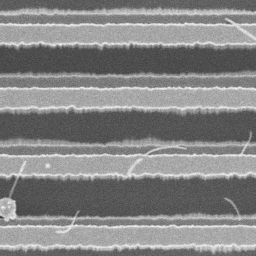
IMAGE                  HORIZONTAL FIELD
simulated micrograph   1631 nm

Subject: lines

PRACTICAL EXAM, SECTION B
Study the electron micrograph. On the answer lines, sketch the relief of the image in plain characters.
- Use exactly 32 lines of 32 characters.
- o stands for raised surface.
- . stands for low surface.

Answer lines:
................................
................................
oooooooooooooooooooooooooooooooo
oooooooooooooooooooooooooooooooo
oooooooooooooooooooooooooooooooo
oooooooooooooooooooooooooooooooo
................................
................................
................................
oooo.o.ooooo.oooooo.o..ooooooooo
oooooooooooooooooooooooooooooooo
oooooooooooooooooooooooooooooooo
oooooooooooooooooooooooooooooooo
oooooooo.ooooo...oooo.oo.ooooo.o
................................
................................
................................
................................
oooooooooooooooooooooooooooooooo
oooooooooooooooooooooooooooooooo
oooooooooooooooooooooooooooooooo
oooooooooooooooooooooooooooooooo
................................
................................
................................
oo..............................
oo..............................
oooooooooooooooooooooooooooooooo
oooooooooooooooooooooooooooooooo
oooooooooooooooooooooooooooooooo
oooooooooooooooooooooooooooooooo
................................